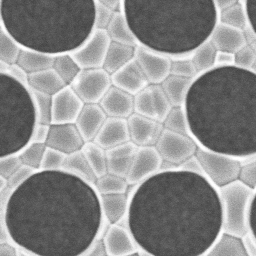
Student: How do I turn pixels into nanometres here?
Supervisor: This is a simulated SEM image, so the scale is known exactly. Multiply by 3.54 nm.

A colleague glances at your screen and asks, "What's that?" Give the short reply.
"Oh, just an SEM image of holes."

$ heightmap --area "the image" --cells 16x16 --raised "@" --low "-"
------@@-----@@-
------@@-----@@@
@----@@@@----@@@
@@@@@@@@@@@@@@@@
@@@@@@@@@@@@@---
--@@@@@@@@@@----
--@@@@@@@@@@----
--@@@@@@@@@@----
--@@@@@@@@@@----
-@@@@@@@@@@@@---
@@@@@@@@@@@@@@@@
@----@@@@----@@@
@-----@@------@@
------@@------@@
@-----@@------@@
@@----@@@----@@@